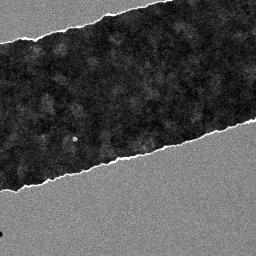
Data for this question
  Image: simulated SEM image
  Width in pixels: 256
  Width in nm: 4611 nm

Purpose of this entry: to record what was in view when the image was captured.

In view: one or a few lines or trenches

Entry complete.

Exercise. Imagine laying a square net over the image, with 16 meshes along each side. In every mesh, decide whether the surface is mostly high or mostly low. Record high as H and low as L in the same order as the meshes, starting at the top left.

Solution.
LLLLLLLLLHHHHHHH
LLLLLLHHHHHHHHHH
LHHHHHHHHHHHHHHH
HHHHHHHHHHHHHHHH
HHHHHHHHHHHHHHHH
HHHHHHHHHHHHHHHH
HHHHHHHHHHHHHHHH
HHHHHHHHHHHHHHHH
HHHHHHHHHHHHHLLL
HHHHHHHHHHLLLLLL
HHHHHHLLLLLLLLLL
HHHLLLLLLLLLLLLL
LLLLLLLLLLLLLLLL
LLLLLLLLLLLLLLLL
LLLLLLLLLLLLLLLL
LLLLLLLLLLLLLLLL